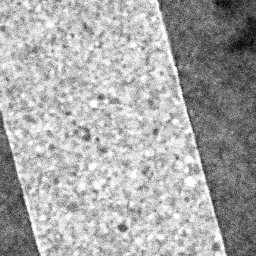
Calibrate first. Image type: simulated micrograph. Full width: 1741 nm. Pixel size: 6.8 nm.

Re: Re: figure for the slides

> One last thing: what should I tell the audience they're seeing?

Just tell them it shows one or a few lines or trenches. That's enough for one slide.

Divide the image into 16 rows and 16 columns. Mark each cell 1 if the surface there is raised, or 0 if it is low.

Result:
1111111111000000
1111111111000000
1111111111000000
1111111111100000
1111111111100000
1111111111100000
1111111111110000
1111111111110000
0111111111110000
0111111111110000
0111111111111000
0111111111111000
0011111111111000
0011111111111000
0011111111111100
0011111111111100